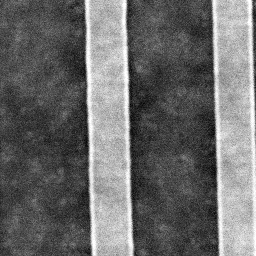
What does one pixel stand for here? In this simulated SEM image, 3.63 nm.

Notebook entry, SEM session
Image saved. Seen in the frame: one or a few lines or trenches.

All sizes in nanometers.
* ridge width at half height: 136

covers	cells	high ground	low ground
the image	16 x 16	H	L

LLLLLHHHLLLLLHHH
LLLLLHHHLLLLLHHH
LLLLLHHHLLLLLHHH
LLLLLHHHLLLLLHHH
LLLLLLHHLLLLLHHH
LLLLLLHHLLLLLLHH
LLLLLLHHLLLLLLHH
LLLLLLHHLLLLLLHH
LLLLLLHHLLLLLLHH
LLLLLLHHLLLLLLHH
LLLLLLHHLLLLLLHH
LLLLLLHHLLLLLLHH
LLLLLLHHLLLLLLHH
LLLLLLHHLLLLLLHH
LLLLLLHHLLLLLLHH
LLLLLLHHLLLLLLHH